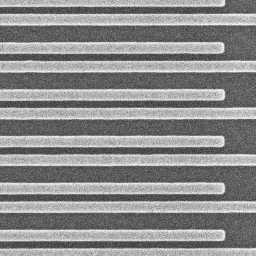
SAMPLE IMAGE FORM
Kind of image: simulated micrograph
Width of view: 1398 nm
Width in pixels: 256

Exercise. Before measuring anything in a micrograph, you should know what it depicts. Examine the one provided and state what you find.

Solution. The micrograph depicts parallel lines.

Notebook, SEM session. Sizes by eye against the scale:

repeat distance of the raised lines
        24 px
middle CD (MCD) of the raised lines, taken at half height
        57.3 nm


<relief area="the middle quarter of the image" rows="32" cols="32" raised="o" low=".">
oooooooooooooooooooooooooooooooo
oooooooooooooooooooooooooooooooo
................................
................................
................................
................................
oooooooooooooooooooooooooooooooo
oooooooooooooooooooooooooooooooo
oooooooooooooooooooooooooooooooo
................................
................................
oooooooooooooooooooooooooooooooo
oooooooooooooooooooooooooooooooo
oooooooooooooooooooooooooooooooo
................................
................................
................................
................................
oooooooooooooooooooooooooooooooo
oooooooooooooooooooooooooooooooo
oooooooooooooooooooooooooooooooo
................................
................................
oooooooooooooooooooooooooooooooo
oooooooooooooooooooooooooooooooo
................................
................................
................................
................................
................................
oooooooooooooooooooooooooooooooo
oooooooooooooooooooooooooooooooo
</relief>